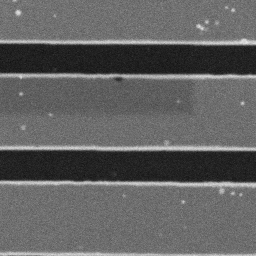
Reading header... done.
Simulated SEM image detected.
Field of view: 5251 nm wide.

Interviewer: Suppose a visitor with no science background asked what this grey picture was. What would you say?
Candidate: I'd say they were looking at lines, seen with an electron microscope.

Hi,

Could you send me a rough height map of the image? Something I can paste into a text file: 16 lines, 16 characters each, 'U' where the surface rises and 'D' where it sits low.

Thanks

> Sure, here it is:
UUUUUUUUUUUUUUUU
UUUUUUUUUUUUUUUU
UUUUUUUUUUUUUUUU
DDDDDDDDDDDDDDDD
DDDDDDDDDDDDDDDD
UUUUUUUUUUUUUUUU
UUUUUUUUUUUUUUUU
UUUUUUUUUUUUUUUU
UUUUUUUUUUUUUUUU
DDDDDDDDDDDDDDDD
DDDDDDDDDDDDDDDD
UUUUUUUUUUUUUUUU
UUUUUUUUUUUUUUUU
UUUUUUUUUUUUUUUU
UUUUUUUUUUUUUUUU
UUUUUUUUUUUUUUUU